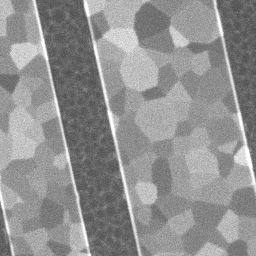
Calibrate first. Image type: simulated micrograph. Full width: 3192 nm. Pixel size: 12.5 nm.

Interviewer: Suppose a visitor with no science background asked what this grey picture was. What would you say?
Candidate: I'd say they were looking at one or a few lines or trenches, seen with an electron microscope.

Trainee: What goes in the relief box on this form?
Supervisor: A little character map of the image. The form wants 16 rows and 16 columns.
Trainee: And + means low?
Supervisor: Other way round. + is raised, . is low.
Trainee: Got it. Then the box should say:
++...+++++++++..
++....++++++++..
+++...++++++++..
+++...++++++++..
+++...++++++++..
+++...+++++++++.
++++...++++++++.
++++...++++++++.
++++...++++++++.
++++...+++++++++
++++....++++++++
+++++...++++++++
+++++...++++++++
+++++...++++++++
+++++...++++++++
.+++++...+++++++